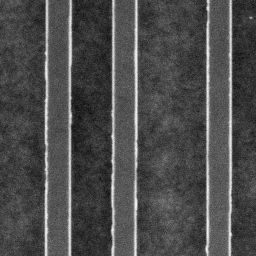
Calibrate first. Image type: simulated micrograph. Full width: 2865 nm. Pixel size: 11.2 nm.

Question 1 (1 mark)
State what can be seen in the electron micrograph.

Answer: lines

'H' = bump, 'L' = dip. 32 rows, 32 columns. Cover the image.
LLLLLLHHHLLLLLHHHLLLLLLLLLHHHLLL
LLLLLLHHHLLLLLHHHLLLLLLLLLHHHLLL
LLLLLLHHHLLLLLHHHLLLLLLLLLHHHLLL
LLLLLLHHHLLLLLHHHLLLLLLLLLHHHLLL
LLLLLLHHHLLLLLHHHLLLLLLLLLHHHLLL
LLLLLLHHHLLLLLHHHLLLLLLLLLHHHLLL
LLLLLLHHHLLLLLHHHLLLLLLLLLHHHLLL
LLLLLLHHHLLLLLHHHLLLLLLLLLHHHLLL
LLLLLLHHHLLLLLHHHLLLLLLLLLHHHLLL
LLLLLLHHHLLLLLHHHLLLLLLLLLHHHLLL
LLLLLLHHHLLLLLHHHLLLLLLLLLHHHLLL
LLLLLLHHHLLLLLHHHLLLLLLLLLHHHLLL
LLLLLLHHHLLLLLHHHLLLLLLLLLHHHLLL
LLLLLLHHHLLLLLHHHLLLLLLLLLHHHLLL
LLLLLLHHHLLLLLHHHLLLLLLLLLHHHLLL
LLLLLLHHHLLLLLHHHLLLLLLLLLHHHLLL
LLLLLLHHHLLLLLHHHLLLLLLLLLHHHLLL
LLLLLLHHHLLLLLHHHLLLLLLLLLHHHLLL
LLLLLLHHHLLLLLHHHLLLLLLLLLHHHLLL
LLLLLLHHHLLLLLHHHLLLLLLLLLHHHLLL
LLLLLLHHHLLLLLHHHLLLLLLLLLHHHLLL
LLLLLLHHHLLLLLHHHLLLLLLLLLHHHLLL
LLLLLLHHHLLLLLHHHLLLLLLLLLHHHLLL
LLLLLLHHHLLLLLHHHLLLLLLLLLHHHLLL
LLLLLLHHHLLLLLHHHLLLLLLLLLHHHLLL
LLLLLLHHHLLLLLHHHLLLLLLLLLHHHLLL
LLLLLLHHHLLLLLHHHLLLLLLLLLHHHLLL
LLLLLLHHHLLLLLHHHLLLLLLLLLHHHLLL
LLLLLLHHHLLLLLHHHLLLLLLLLLHHHLLL
LLLLLLHHHLLLLLHHHLLLLLLLLLHHHLLL
LLLLLLHHHLLLLLHHHLLLLLLLLLHHHLLL
LLLLLLHHHLLLLLHHHLLLLLLLLLHHHLLL